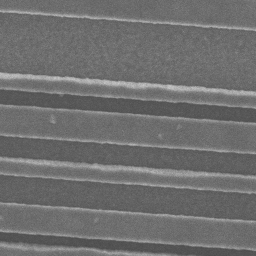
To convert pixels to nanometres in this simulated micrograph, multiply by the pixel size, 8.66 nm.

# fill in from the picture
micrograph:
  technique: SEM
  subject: lines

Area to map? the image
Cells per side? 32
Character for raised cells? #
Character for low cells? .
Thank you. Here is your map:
################################
################################
..............##################
.............................###
................................
................................
................................
................................
................................
#####...........................
################................
.....##########################.
...................#############
######.........................#
###################.............
################################
################################
........########################
......................##########
................................
##########......................
######################..........
.........#######################
.......................#########
................................
##..............................
#################...............
############################....
################################
........########################
#...................############
################................